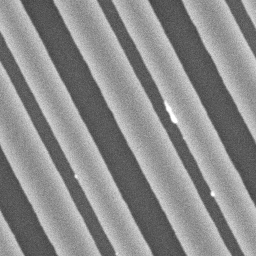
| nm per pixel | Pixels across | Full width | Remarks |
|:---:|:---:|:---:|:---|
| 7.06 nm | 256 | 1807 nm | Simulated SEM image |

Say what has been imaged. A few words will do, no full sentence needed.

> lines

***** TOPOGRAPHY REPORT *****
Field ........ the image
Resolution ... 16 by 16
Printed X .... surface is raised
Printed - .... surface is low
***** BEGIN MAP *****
X---XXXXX---XXXX
XX--XXXXXX--XXXX
XXX--XXXXX---XXX
XXX--XXXXXX--XXX
XXXX--XXXXXX--XX
XXXX--XXXXXX--XX
XXXXX--XXXXXX--X
XXXXX--XXXXXX--X
XXXXXX--XXXXXX--
XXXXXX--XXXXXX--
-XXXXXX--XXXXXX-
-XXXXXX--XXXXXX-
--XXXXXX--XXXXXX
--XXXXXX--XXXXXX
X--XXXXXX--XXXXX
X--XXXXXX--XXXXX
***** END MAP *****